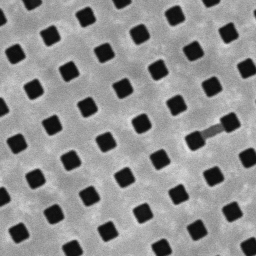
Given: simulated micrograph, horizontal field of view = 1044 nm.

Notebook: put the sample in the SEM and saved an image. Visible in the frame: a regular array of holes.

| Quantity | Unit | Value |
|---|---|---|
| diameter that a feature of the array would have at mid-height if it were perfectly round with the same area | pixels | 18.9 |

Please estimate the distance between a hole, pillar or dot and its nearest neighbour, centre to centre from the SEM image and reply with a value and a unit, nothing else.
162 nm